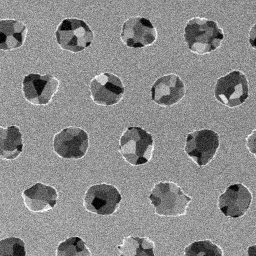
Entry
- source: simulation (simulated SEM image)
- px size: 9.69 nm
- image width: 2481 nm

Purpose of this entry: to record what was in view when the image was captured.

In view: a regular array of raised bodies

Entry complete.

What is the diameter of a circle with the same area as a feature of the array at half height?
0.335 micrometres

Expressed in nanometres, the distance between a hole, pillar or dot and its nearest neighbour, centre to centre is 606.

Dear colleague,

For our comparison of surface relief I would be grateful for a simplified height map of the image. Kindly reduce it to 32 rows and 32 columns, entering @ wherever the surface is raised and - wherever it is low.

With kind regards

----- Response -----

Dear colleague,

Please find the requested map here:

--------------------------------
--------------------------------
-@------@@------@@------@@------
@@@----@@@@----@@@@----@@@@----@
@@@----@@@@@---@@@@@---@@@@@---@
@@@----@@@@-----@@@----@@@@@---@
---------@--------------@@------
--------------------------------
--------------------------------
---@@@------@@@-----@@------@@@-
---@@@@----@@@@----@@@@----@@@@-
---@@@@----@@@@----@@@@----@@@@-
----@@------@@@----@@@-----@@@@-
--------------------------------
--------------------------------
--------------------------------
@@@----@@@@-----@@------@@@-----
@@@----@@@@----@@@@----@@@@----@
@@@----@@@@----@@@@----@@@@----@
@@-----@@@-----@@@@-----@@@-----
----------------@@-------@------
--------------------------------
--------------------------------
----@@@----@@@@----@@@------@@@-
---@@@@----@@@@----@@@@-----@@@-
---@@@@----@@@@----@@@@----@@@@-
------------@@------@@@-----@@@-
--------------------------------
--------------------------------
--------------------------------
@@@-----@@@----@@@@-----@@@-----
@@@----@@@@----@@@@----@@@@@---@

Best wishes